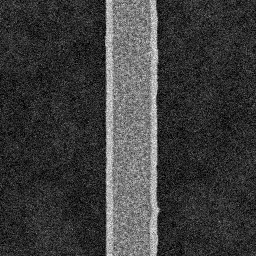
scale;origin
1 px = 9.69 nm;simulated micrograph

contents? one or a few lines or trenches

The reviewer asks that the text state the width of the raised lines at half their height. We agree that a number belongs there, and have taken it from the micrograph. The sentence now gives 436 nanometres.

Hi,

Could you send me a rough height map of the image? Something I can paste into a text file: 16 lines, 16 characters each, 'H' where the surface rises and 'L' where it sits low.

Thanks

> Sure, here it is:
LLLLLLLHHHLLLLLL
LLLLLLLHHHLLLLLL
LLLLLLLHHHLLLLLL
LLLLLLLHHHLLLLLL
LLLLLLLHHHLLLLLL
LLLLLLLHHHLLLLLL
LLLLLLLHHHLLLLLL
LLLLLLLHHHLLLLLL
LLLLLLLHHHLLLLLL
LLLLLLLHHHLLLLLL
LLLLLLLHHHLLLLLL
LLLLLLLHHHLLLLLL
LLLLLLLHHHLLLLLL
LLLLLLLHHHLLLLLL
LLLLLLLHHHLLLLLL
LLLLLLLHHHLLLLLL